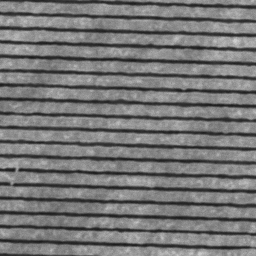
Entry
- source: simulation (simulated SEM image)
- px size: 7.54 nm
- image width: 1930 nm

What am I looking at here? parallel lines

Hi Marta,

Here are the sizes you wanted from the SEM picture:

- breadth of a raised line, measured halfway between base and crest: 0.0763 micrometres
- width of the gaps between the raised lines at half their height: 28.2 nm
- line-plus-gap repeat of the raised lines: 0.107 microns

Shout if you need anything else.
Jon